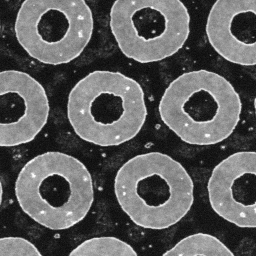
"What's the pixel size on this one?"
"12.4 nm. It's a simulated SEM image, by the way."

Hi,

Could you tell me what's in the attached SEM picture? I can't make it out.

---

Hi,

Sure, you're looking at ring-shaped raised bodies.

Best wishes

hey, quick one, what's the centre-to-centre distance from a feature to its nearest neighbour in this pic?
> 1.17 µm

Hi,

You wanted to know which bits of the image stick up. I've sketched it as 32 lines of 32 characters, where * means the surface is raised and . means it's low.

...********...*********....*****
..****..***...***...***...****..
..***....***.****....***..***...
..***....***..***....***..***...
..***...***...***...***...***...
...********....********...*****.
....******.....*******.....*****
.....****........***........****
...**...........................
****.......*****.......*****....
*****.....*******....********...
******...*********...***..***...
...***...***...***..***....***..
...***...**....***..***....***..
...***...**....***..****...***..
.*****...*********...*********..
*****.....*******..**.*******...
****.......*****.......*****....
................................
.....****........****........***
...*******......******.....*****
...********....********..*.*****
..***...***.*.****...***..***...
..***....****.***....***..***...
..***.....**...**....***..***...
..****...**....***..****..****..
...********.....*******....*****
....******.......*****......****
......**..........**............
........................**......
****......******......******....
*****....********....********...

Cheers